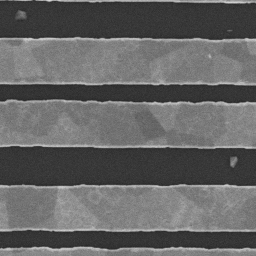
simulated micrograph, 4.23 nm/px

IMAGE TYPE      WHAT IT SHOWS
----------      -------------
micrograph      lines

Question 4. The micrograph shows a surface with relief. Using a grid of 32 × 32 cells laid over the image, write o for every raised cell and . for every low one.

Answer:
................................
................................
................................
................................
................................
oooooooooooooooooooooooooooooooo
oooooooooooooooooooooooooooooooo
oooooooooooooooooooooooooooooooo
oooooooooooooooooooooooooooooooo
oooooooooooooooooooooooooooooooo
..........................o....o
................................
................................
oooooooooooooooooooooooooooooooo
oooooooooooooooooooooooooooooooo
oooooooooooooooooooooooooooooooo
oooooooooooooooooooooooooooooooo
oooooooooooooooooooooooooooooooo
................................
................................
................................
................................
................................
oooooooooooooooooooooooooooooooo
oooooooooooooooooooooooooooooooo
oooooooooooooooooooooooooooooooo
oooooooooooooooooooooooooooooooo
oooooooooooooooooooooooooooooooo
oooooooooooooooooooooooooooooooo
................................
................................
oooooooooooooooooooooooooooooooo